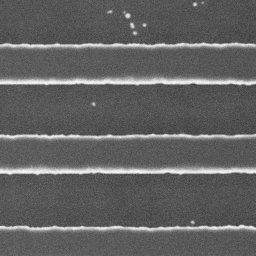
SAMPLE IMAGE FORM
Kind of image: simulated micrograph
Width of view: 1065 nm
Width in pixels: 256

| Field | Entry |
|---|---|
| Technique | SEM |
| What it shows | lines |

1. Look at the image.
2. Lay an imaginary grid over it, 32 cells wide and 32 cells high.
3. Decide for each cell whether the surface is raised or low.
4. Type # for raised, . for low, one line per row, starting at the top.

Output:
................................
................................
................................
................................
................................
.........................#...#..
################################
################################
################################
################################
................................
................................
................................
................................
................................
................................
................................
################################
################################
################################
################################
###.####.##...######..#....#....
................................
................................
................................
................................
................................
................................
################################
################################
################################
################################